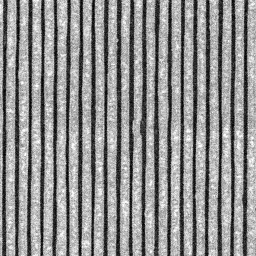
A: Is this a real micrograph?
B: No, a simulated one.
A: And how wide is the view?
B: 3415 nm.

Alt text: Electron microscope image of parallel lines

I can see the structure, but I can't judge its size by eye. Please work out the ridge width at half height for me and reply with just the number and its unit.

115 nanometres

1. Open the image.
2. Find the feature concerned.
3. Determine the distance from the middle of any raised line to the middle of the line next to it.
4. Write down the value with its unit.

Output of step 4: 169 nanometres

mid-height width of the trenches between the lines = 57.5 nm